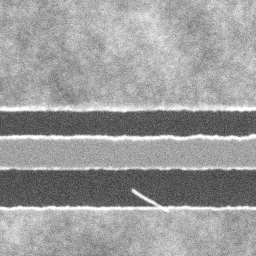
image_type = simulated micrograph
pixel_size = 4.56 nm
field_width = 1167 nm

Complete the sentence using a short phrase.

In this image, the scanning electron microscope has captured lines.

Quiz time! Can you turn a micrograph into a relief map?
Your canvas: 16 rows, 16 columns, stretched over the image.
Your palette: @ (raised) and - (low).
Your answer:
@@@@@@@@@@@@@@@@
@@@@@@@@@@@@@@@@
@@@@@@@@@@@@@@@@
@@@@@@@@@@@@@@@@
@@@@@@@@@@@@@@@@
@@@@@@@@@@@@@@@@
@@@@@@@@@@@@@@@@
----------------
----------------
@@@@@@@@@@@@@@@@
@@@@@@@@@@@@@@@@
----------------
----------------
@@@@@@@@@@@@@@@@
@@@@@@@@@@@@@@@@
@@@@@@@@@@@@@@@@